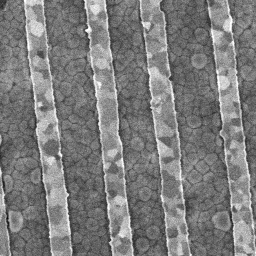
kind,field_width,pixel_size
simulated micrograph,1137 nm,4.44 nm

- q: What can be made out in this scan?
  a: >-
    one or a few lines or trenches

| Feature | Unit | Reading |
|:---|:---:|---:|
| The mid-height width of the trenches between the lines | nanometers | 183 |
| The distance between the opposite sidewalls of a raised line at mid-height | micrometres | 0.0894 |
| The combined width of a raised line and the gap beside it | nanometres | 270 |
